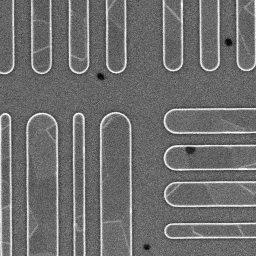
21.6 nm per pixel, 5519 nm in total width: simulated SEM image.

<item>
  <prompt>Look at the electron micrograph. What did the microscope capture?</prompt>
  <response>groups of lines, slits or small figures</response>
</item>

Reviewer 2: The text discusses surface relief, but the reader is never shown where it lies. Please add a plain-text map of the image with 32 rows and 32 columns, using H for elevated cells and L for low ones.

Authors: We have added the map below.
HHLLHHLLLHHLLHHHLLLLHHHLLHHLLLHH
HHLLHHLLLHHLLHHHLLLLHHHLLHHLLLHH
HHLLHHLLLHHLLHHHLLLLHHHLLHHLLLHH
HHLLHHLLLHHLLHHHLLLLHHHLLHHLLLHH
HHLLHHLLLHHLLHHHLLLLLHHLLHHLLLHH
HHLLHHLLLHHLLHHHLLLLLHHLLHHLLLHH
HHLLHHLLLHHLLHHHLLLLLHHLLHHLLLHH
HHLLHHLLLHHLLHHHLLLLLHHLLHHLLLHH
HHLLHHLLLHHLLLHHLLLLLHLLLHHLLLHH
LLLLLLLLLLLLLLLLLLLLLLLLLLLLLLLL
LLLLLLLLLLLLLLLLLLLLLLLLLLLLLLLL
LLLLLLLLLLLLLLLLLLLLLLLLLLLLLLLL
LLLLLLLLLLLLLLLLLLLLLLLLLLLLLLLL
LLLLLLLLLLLLLLLLLLLLLLLLLLLLLLLL
HLLLHHLLLHLLLHHHLLLLLHHHHHHHHHHH
HLLHHHHLLHLLLHHHLLLLLHHHHHHHHHHH
HLLHHHHLLHLLLHHHLLLLLLHHHHHHHHHH
HLLHHHHLLHLLLHHHLLLLLLLLLLLLLLLL
HLLHHHHLLHLLLHHHLLLLLHHHHHHHHHHH
HLLHHHHLLHLLLHHHLLLLLHHHHHHHHHHH
HLLHHHHLLHLLLHHHLLLLLHHHHHHHHHHH
HLLHHHHLLHLLLHHHLLLLLLLLLLLLLLLL
HLLHHHHLLHLLLHHHLLLLLLLLLLLLLLLL
HLLHHHHLLHLLLHHHLLLLLHHHHHHHHHHH
HLLHHHHLLHHLLHHHLLLLLHHHHHHHHHHH
HLLHHHHLLHHLLHHHLLLLLHHHHHHHHHHH
HLLHHHHLLHLLLHHHLLLLLLLLLLLLLLLL
HLLHHHHLLHHLLHHHLLLLLLLLLLLLLLLL
HLLHHHHLLHHLLHHHLLLLLHHHHHHHHHHH
HLLLHHHLLHHLLHHHLLLLLHHHHHHHHHHH
HLLLHHHLLHHLLHHHLLLLLLLLLLLLLLLL
HLLLHHHLLHHLLHHHLLLLLLLLLLLLLLLL